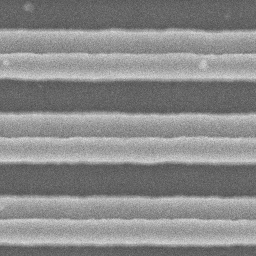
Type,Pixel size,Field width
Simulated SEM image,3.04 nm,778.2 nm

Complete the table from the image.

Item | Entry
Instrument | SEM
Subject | lines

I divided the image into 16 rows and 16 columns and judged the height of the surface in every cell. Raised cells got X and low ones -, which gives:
----------------
----------------
XXXXXXXXXXXXXXXX
XXXXXXXXXXXXXXXX
XXXXXXXXXXXXXXXX
----------------
----------------
XXXXXXXXXXXXXXXX
XXXXXXXXXXXXXXXX
XXXXXXXXXXXXXXXX
----------------
----------------
XXXXXXXXXXXXXXXX
XXXXXXXXXXXXXXXX
XXXXXXXXXXXXXXXX
----------------